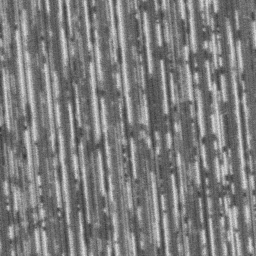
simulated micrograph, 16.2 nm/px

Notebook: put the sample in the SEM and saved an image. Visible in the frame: parallel lines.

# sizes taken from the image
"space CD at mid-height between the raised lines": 26.2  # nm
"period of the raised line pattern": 81.8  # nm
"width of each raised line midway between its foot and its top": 52.4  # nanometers